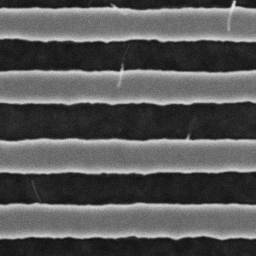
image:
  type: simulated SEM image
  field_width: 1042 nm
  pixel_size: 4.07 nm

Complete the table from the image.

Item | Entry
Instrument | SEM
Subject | lines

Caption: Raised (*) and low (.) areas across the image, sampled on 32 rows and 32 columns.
................................
********************************
********************************
********************************
********************************
................................
................................
................................
................................
********************************
********************************
********************************
********************************
................................
................................
................................
................................
...*************..**************
********************************
********************************
********************************
.********.**********..**.***....
................................
................................
................................
....*............*..............
********************************
********************************
********************************
********************************
................................
................................